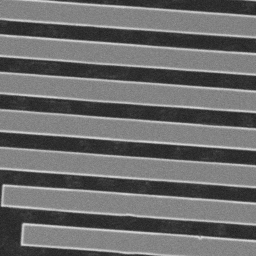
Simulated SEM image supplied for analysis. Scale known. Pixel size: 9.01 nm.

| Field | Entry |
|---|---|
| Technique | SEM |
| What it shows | parallel lines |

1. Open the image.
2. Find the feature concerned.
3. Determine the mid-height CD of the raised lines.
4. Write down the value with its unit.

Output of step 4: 22 pixels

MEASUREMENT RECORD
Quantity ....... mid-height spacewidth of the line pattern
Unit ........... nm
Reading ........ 140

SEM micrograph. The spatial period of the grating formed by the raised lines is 0.336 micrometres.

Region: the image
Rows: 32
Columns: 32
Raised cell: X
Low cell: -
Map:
XXXXXXXXXXX---------------------
XXXXXXXXXXXXXXXXXXXXXXXX--------
-XXXXXXXXXXXXXXXXXXXXXXXXXXXXXXX
---------------XXXXXXXXXXXXXXXXX
X-----------------------------XX
XXXXXXXXXXXXXXX-----------------
XXXXXXXXXXXXXXXXXXXXXXXXXXXX----
-------XXXXXXXXXXXXXXXXXXXXXXXXX
---------------------XXXXXXXXXXX
XXXXX---------------------------
XXXXXXXXXXXXXXXXXXX-------------
XXXXXXXXXXXXXXXXXXXXXXXXXXXXXXXX
----------XXXXXXXXXXXXXXXXXXXXXX
-------------------------XXXXXXX
XXXXXXXXXXX---------------------
XXXXXXXXXXXXXXXXXXXXXXX---------
--XXXXXXXXXXXXXXXXXXXXXXXXXXXXXX
---------------XXXXXXXXXXXXXXXXX
X----------------------------XXX
XXXXXXXXXXXXXX------------------
XXXXXXXXXXXXXXXXXXXXXXXXXXXXX---
------XXXXXXXXXXXXXXXXXXXXXXXXXX
-------------------XXXXXXXXXXXXX
XXXXXX--------------------------
XXXXXXXXXXXXXXXXXXX-------------
XXXXXXXXXXXXXXXXXXXXXXXXXXXXXXXX
----------XXXXXXXXXXXXXXXXXXXXXX
-----------------------XXXXXXXXX
---XXXXXXX----------------------
---XXXXXXXXXXXXXXXXXXXX---------
---XXXXXXXXXXXXXXXXXXXXXXXXXXXXX
--------------XXXXXXXXXXXXXXXXXX